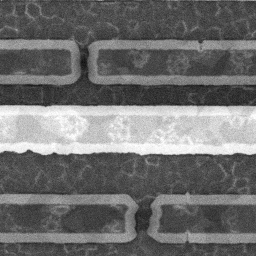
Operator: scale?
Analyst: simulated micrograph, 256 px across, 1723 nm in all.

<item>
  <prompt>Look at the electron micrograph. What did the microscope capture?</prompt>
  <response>one or a few lines or trenches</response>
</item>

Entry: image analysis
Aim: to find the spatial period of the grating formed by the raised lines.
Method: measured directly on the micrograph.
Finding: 526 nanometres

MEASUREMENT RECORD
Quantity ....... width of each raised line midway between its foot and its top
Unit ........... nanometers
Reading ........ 263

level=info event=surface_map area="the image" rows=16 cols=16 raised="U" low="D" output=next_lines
DDDDDDDDDDDDDDDD
DDDDDDDDDDDDDDDD
DDDDDDDDDDDDDDDD
UUUUUDUUUUUUUUUU
UUUUUDUUUUUUUUUU
DDDDDDDDDDDDDDDD
DDDDDDDDDDDDDDDD
UUUUUUUUUUUUUUUU
UUUUUUUUUUUUUUUU
DDDDDDDDDDDDDDDD
DDDDDDDDDDDDDDDD
DDDDDDDDDDDDDDDD
UUUUDUUUDDUUUUUU
UUUUUUUUDDUUUUUU
UUUUUUUUDDUUUUUU
DDDDDDDDDDDDDDDD